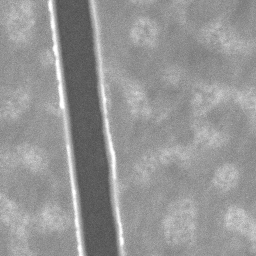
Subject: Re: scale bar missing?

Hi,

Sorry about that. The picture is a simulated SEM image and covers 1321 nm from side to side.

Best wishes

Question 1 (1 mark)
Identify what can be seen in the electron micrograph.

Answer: one or a few lines or trenches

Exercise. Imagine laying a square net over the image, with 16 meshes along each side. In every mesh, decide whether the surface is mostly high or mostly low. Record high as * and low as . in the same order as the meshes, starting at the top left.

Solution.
***...**********
***...**********
****..**********
****..**********
****..**********
****..**********
****..**********
****...*********
****...*********
****...*********
*****..*********
*****..*********
*****..*********
*****..*********
*****..*********
*****...********